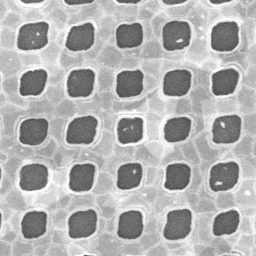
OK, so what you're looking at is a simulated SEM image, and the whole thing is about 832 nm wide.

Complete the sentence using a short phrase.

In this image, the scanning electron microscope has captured a regular array of holes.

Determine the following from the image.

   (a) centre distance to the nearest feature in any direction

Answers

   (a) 151 nm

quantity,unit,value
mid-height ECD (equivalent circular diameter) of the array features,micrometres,0.0985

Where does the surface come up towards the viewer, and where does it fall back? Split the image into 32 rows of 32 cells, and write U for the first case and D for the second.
UUUDDUUUDDDUUUUUUUUUUDDUUUUDUUUU
UUUUUUUUUUUUUUUUUUUUUUUUUUUUUUUU
UUUUUUUUUUUUUUUUUUUUUUUUUUUUUUUU
UUDDDDUUUDDDUUUDDDUUDDDDUUUDDDUU
UUDDDDUUDDDDUUDDDDUUDDDDUUDDDDUU
UUDDDDUUDDDDUUUDDDUUDDDDUUDDDDUU
UUUUUUUUUUUUUUUUUUUUUUUUUUUDDUUU
UUUUUUUUUUUUUUUUUUUUUUUUUUUUUUUU
UUUUUUUUUUDUUUUUUUUUUUUUUUUUDUUU
UUUDDDUUDDDDUUUDDDUUDDDDUUDDDDUU
UUDDDDUUDDDDUUUDDDUUDDDDUUDDDDUU
UUDDDUUUDDDDUUDDDDUUDDDUUUUDDUUU
UUUUUUUUUUUUUUUUUUUUUUUUUUUUUUUU
UUUUUUUUUUUUUUUUUUUUUUUUUUUUUUUU
UUUUUUUUUUDDUUUUUUUUUUUUUUUDDDUU
UUUDDDUUUDDDUUUDDDUUUDDDUUDDDDUU
UUDDDDUUDDDDUUUDDDUUDDDDUUDDDDUU
UUDDDDUUDDDDUUUDDDUUUDDUUUDDDDUU
UUUUUUUUUUUUUUUUUUUUUUUUUUUUUUUU
UUUUUUUUUUUUUUUUUUUUUUUUUUUUUUUU
UUUDDDUUUDDDUUUDDDUUUDDUUUUDDDUU
UUDDDDUUUDDDUUUDDDUUUDDDUUDDDDUU
UUDDDDUUUDDDUUDDDDUUUDDDUUDDDDUU
UUUDDDUUUDDUUUUDDUUUUDDUUUDDDUUU
UUUUUUUUUUUUUUUUUUUUUUUUUUUUUUUU
UUUUUUUUUUUUUUUUUUUUUUUUUUUUUUUU
UUUDDDUUUDDDUUUDDDUUUDDDUUUUDDUU
UUUDDDUUDDDDUUUDDDUUUDDDUUUDDDUU
UUUDDDUUDDDDUUUDDDUUDDDDUUUDDDUU
UUUDDUUUUDDUUUUDDDUUDDDDUUUDUUUU
UUUUUUUUUUUUUUUUUUUUUUUUUUUUUUUU
UUUUUUUUUUUUUUUUUUUUUUUUUUUUUUUU